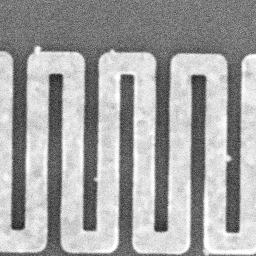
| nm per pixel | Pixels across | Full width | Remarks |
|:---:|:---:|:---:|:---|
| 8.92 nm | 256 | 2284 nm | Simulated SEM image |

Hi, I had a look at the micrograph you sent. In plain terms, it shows groups of lines, slits or small figures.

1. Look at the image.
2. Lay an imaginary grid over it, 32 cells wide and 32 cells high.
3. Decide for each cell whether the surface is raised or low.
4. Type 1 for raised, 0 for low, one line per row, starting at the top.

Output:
00000000000000000000000000000000
00000000000000000000000000000000
00000000000000000000000000000000
00000000000000000000000000000000
00000000000000000000000000000000
00000000000000000000000000000000
00000000000000000000000000000000
10001111110011111110001111110001
10001111110011111110011111110011
10001100110011100110011100110011
10011100110011100110011100110011
10011100110011100110011100110011
10011100110011100110011100110011
10011100110011100110011100110011
10011100110011100110011100110011
10011100110011100110011100110011
10011100110011100110011100110011
10001100110011100110011100110011
10001100110011100110011100110011
10001100110011100110011100110011
10001100110011100110011100110011
10011100110011100110011100110011
10011100110011100110011100110011
10011100110011100110011100110011
10011100110011100110011100110011
10011100110011100110011000110011
10011100110011100110011000110011
10011100110011100110011100110011
10011100110011100110011100110011
11111100111111100111111100111111
11111100111111100111111000111111
00000000011100000111111000111111